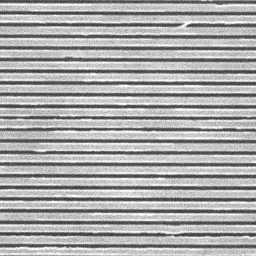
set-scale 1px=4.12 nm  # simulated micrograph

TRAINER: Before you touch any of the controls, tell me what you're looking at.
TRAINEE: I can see parallel lines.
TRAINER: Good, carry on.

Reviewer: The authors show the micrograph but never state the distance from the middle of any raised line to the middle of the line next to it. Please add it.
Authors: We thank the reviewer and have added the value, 47.8 nm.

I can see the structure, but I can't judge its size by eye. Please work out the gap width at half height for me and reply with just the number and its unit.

0.016 micrometres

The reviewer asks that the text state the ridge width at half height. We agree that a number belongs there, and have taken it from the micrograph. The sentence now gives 31.9 nanometers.